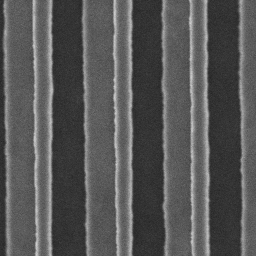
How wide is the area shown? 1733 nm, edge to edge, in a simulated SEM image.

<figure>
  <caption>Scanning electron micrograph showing lines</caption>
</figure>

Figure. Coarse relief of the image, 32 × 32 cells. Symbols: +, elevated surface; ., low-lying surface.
.+++++.....+++++....++++++....++
.+++++.....+++++....++++++....++
.+++++....++++++....++++++....++
.+++++.....+++++....++++++....++
.+++++.....+++++....++++++....++
.+++++.....+++++....++++++....++
.+++++.....+++++.....+++++....++
.+++++.....+++++....++++++....++
.+++++.....+++++.....+++++....++
.+++++.....+++++....++++++....++
.++++++....+++++....++++++....++
.++++++....+++++....++++++....++
.+++++.....+++++.....+++++....++
.+++++.....+++++.....+++++....++
.+++++.....+++++.....+++++....++
.+++++.....+++++.....+++++....++
.+++++.....++++++....+++++....++
.+++++.....+++++.....+++++....++
.+++++.....+++++.....+++++....++
.+++++.....+++++.....+++++....++
.+++++.....+++++.....+++++....++
.+++++.....+++++.....+++++....++
.+++++.....+++++.....+++++....++
.+++++.....+++++.....+++++....++
.+++++.....+++++.....+++++....++
.+++++.....+++++.....+++++....++
.+++++.....+++++.....+++++....++
.+++++.....++++++....+++++....++
.+++++.....+++++.....+++++....++
.+++++.....++++++....+++++....++
.+++++.....+++++.....+++++....++
.+++++.....+++++.....+++++....++